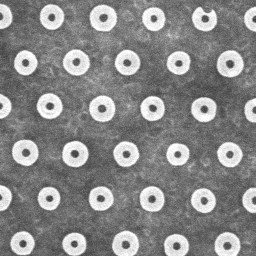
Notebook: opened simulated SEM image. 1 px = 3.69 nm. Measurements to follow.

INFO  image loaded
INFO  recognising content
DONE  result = a regular array of ring-shaped raised bodies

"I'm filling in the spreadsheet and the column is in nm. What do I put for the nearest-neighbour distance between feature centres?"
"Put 187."